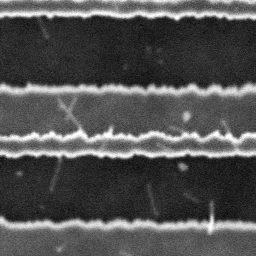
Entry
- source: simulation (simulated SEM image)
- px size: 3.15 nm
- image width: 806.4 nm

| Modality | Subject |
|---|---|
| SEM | lines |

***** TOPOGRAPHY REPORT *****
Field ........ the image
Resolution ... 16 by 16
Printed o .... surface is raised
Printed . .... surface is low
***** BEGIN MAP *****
oooooooooooooooo
................
................
................
................
................
oooooooooooooooo
oooooooooooooooo
oooooooooooooooo
oooooooooooooooo
................
................
................
................
oooooooooooooooo
oooooooooooooooo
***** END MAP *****